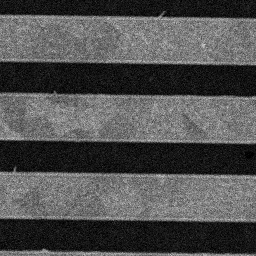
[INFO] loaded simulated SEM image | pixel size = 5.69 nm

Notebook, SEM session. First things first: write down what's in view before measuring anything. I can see one or a few lines or trenches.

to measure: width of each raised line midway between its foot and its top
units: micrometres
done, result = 0.257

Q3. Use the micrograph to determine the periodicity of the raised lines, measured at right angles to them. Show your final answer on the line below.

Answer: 0.446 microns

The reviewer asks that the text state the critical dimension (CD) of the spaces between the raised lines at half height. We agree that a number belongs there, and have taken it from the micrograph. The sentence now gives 0.19 um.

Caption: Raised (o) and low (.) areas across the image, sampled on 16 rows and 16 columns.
................
oooooooooooooooo
oooooooooooooooo
oooooooooooooooo
................
................
oooooooooooooooo
oooooooooooooooo
oooooooooooooooo
................
................
oooooooooooooooo
oooooooooooooooo
oooooooooooooooo
................
................